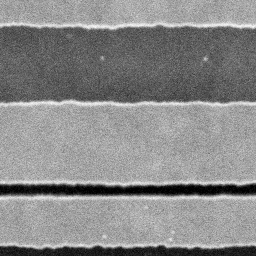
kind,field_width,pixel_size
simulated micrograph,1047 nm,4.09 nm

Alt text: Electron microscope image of lines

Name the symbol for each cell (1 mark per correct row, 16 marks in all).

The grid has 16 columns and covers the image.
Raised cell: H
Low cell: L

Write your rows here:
HHHHHHHHHHHHHHHH
HHHHHHHHHHHHHHHH
LLLLLLLLLLLLLLLL
LLLLLLLLLLLLLLLL
LLLLLLLLLLLLLLLL
LLLLLLLLLLLLLLLL
LHHHHHHHHHHHHLHH
HHHHHHHHHHHHHHHH
HHHHHHHHHHHHHHHH
HHHHHHHHHHHHHHHH
HHHHHHHHHHHHHHHH
HHHHHHHHHHHHHHHH
HHHHHHHHHHHHHHHH
HHHHHHHHHHHHHHHH
HHHHHHHHHHHHHHHH
LLLLLLLLLLLLLLLL